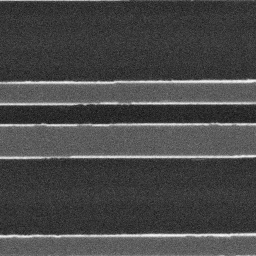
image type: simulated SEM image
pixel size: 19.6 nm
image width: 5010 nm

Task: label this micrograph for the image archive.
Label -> lines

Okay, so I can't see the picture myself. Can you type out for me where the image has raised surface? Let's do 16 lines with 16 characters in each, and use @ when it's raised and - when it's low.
----------------
----------------
----------------
----------------
----------------
@@@@@@@@@@@@@@@@
@@@@@@@@@@@@@@@@
@@@@@@@@@@@@@@@@
@@@@@@@@@@@@@@@@
@@@@@@@@@@@@@@@@
----------------
----------------
----------------
----------------
----------------
@@@@@@@@@@@@@@@@